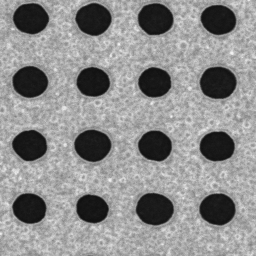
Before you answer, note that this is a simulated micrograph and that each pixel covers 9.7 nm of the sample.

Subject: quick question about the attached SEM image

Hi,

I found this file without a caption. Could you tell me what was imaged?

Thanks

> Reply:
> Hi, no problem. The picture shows a regular array of holes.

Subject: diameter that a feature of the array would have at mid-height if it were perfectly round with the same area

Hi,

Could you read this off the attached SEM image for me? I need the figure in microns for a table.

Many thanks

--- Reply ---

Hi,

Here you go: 0.321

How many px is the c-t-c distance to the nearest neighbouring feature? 62.4